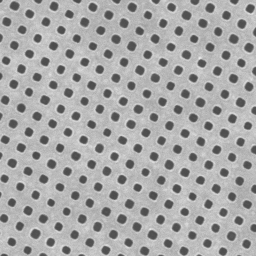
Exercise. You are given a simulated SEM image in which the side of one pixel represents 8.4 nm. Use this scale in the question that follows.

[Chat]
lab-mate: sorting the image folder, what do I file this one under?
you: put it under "a regular array of holes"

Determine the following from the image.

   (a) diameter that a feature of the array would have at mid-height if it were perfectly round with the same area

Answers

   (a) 75.2 nm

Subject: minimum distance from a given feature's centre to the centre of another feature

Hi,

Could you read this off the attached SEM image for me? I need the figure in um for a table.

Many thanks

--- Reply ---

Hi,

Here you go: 0.144